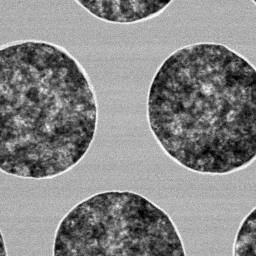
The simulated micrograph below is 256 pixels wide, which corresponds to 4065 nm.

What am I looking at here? holes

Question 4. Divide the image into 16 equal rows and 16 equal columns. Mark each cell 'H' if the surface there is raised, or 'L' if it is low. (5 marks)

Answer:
HHHHHLLLLLHHHHHH
HHHHHHHHHHHHHHHH
HHHHHHHHHHHHHHHH
LLLLHHHHHHHLLLLH
LLLLLHHHHHLLLLLL
LLLLLLHHHLLLLLLL
LLLLLLHHHLLLLLLL
LLLLLLHHHLLLLLLL
LLLLLLHHHHLLLLLL
LLLLLHHHHHHLLLLL
LLLLHHHHHHHHLLLH
HHHHHHHHHHHHHHHH
HHHHHLLLLHHHHHHH
HHHHLLLLLLHHHHHH
HHHHLLLLLLLHHHHL
HHHLLLLLLLLHHHHL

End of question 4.